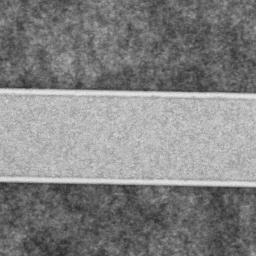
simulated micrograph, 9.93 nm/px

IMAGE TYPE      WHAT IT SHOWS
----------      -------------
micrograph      one or a few lines or trenches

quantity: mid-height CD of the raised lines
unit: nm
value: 860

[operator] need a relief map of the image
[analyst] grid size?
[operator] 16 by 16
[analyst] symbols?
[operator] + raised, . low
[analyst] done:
................
................
................
................
................
................
++++++++++++++++
++++++++++++++++
++++++++++++++++
++++++++++++++++
++++++++++++++++
................
................
................
................
................